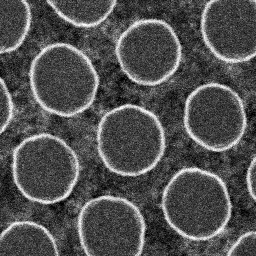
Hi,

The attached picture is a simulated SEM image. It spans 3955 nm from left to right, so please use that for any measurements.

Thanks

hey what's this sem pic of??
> raised bodies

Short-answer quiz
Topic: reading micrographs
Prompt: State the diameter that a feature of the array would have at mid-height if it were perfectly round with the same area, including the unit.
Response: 1020 nm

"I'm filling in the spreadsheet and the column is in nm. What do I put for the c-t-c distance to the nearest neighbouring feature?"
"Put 1380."